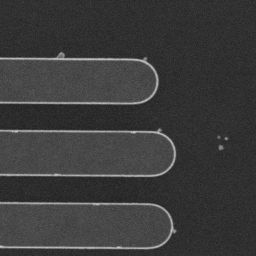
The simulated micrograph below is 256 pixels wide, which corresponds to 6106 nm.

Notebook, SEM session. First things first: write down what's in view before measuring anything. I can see groups of lines, slits or small figures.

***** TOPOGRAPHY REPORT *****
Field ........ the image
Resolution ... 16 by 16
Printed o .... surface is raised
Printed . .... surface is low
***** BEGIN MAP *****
................
................
................
................
oooooooooo......
oooooooooo......
................
................
oooooooooo......
ooooooooooo.....
ooooooooooo.....
................
................
ooooooooooo.....
ooooooooooo.....
.......oo.......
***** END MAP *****